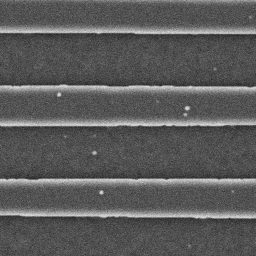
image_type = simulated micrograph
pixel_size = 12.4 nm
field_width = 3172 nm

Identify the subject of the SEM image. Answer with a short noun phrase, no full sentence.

lines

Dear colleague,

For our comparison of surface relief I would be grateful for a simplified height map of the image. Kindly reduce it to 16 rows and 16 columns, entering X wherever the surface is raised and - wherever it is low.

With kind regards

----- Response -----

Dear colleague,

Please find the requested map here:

XXXXXXXXXXXXXXXX
XXXXXXXXXXXXXXXX
----------------
----------------
----------------
XXXXXXXXXXXXXXXX
XXXXXXXXXXXXXXXX
XXXXXXXXXXXXXXXX
----------------
----------------
----------------
XXXXXXXXXXXXXXXX
XXXXXXXXXXXXXXXX
------XXXXXXXXXX
----------------
----------------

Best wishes